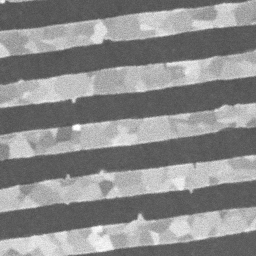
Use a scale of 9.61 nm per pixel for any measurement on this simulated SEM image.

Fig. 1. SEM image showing parallel lines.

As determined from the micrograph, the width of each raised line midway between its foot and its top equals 224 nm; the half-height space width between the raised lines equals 270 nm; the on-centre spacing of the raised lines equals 494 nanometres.